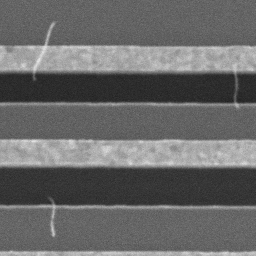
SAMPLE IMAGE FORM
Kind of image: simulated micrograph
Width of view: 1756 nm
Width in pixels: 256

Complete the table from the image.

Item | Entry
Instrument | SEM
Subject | lines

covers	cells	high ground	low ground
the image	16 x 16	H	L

HHHHHHHHHHHHHHHH
HHHHHHHHHHHHHHHH
HHHHHHHHHHHHHHHH
HHHHHHHHHHHHHHHH
LLLLLLLLLLLLLLLL
LLLLLLLLLLLLLLLL
HHHHHHHHHHHHHLHL
HHHHHHHHHHHHHHHH
HHHHHHHHHHHHHHHH
HHHHHHHHHHHHHHHH
LLLLLLLLLLLLLLLL
LLLLLLLLLLLLLLLL
LLLLLLLLLLLLLLLL
HHHHHHHHHHHHHHHH
HHHHHHHHHHHHHHHH
HHHHHHHHHHHHHHHH